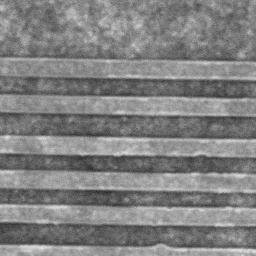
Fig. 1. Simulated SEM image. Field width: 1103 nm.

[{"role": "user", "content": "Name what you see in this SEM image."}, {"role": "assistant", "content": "parallel lines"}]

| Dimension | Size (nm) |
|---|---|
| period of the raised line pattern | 158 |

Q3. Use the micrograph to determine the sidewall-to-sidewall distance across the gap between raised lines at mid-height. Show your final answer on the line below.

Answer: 0.0856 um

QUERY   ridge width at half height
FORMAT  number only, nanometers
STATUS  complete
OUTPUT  74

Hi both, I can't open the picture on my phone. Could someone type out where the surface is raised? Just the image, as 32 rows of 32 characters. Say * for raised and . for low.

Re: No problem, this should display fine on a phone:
................................
................................
................................
................................
................................
................................
................................
**********......................
********************************
........************************
................................
................................
********************************
********************************
................................
................................
................................
**************************..**.*
********************************
..........................******
................................
*********.......................
********************************
......**************************
................................
................................
********************************
********************************
................................
................................
................................
********************************